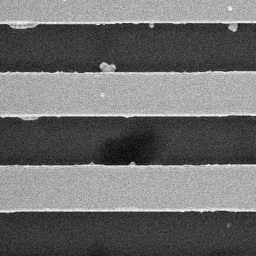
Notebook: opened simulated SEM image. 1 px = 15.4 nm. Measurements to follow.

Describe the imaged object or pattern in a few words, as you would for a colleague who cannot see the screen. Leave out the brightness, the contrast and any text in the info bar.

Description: lines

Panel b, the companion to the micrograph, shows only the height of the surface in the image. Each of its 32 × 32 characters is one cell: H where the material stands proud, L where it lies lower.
HHHHHHHHHHHHHHHHHHHHHHHHHHHHHHHH
HHHHHHHHHHHHHHHHHHHHHHHHHHHHHHHH
HHHHHHHHHHHHHHHHHHHHHHHHHHHHHHHH
LLLLLLLLLLLLLLLLLLLLLLLLLLLLLLLL
LLLLLLLLLLLLLLLLLLLLLLLLLLLLLLLL
LLLLLLLLLLLLLLLLLLLLLLLLLLLLLLLL
LLLLLLLLLLLLLLLLLLLLLLLLLLLLLLLL
LLLLLLLLLLLLLLLLLLLLLLLLLLLLLLLL
LLLLLLLLLLLLLLLLLLLLLLLLLLLLLLLL
HHHHHHHHHHHHHHHHHHHHHHHHHHHHHHHH
HHHHHHHHHHHHHHHHHHHHHHHHHHHHHHHH
HHHHHHHHHHHHHHHHHHHHHHHHHHHHHHHH
HHHHHHHHHHHHHHHHHHHHHHHHHHHHHHHH
HHHHHHHHHHHHHHHHHHHHHHHHHHHHHHHH
LHHLLLLLLLLLLLLLLLLLLLLLLLLLLLLL
LLLLLLLLLLLLLLLLLLLLLLLLLLLLLLLL
LLLLLLLLLLLLLLLLLLLLLLLLLLLLLLLL
LLLLLLLLLLLLLLLLLLLLLLLLLLLLLLLL
LLLLLLLLLLLLLLLLLLLLLLLLLLLLLLLL
LLLLLLLLLLLLLLLLLLLLLLLLLLLLLLLL
LLLLLLLLLLLLLLLLLLLLLLLLLLLLLLLL
HHHHHHHHHHHHHHHHHHHHHHHHHHHHHHHH
HHHHHHHHHHHHHHHHHHHHHHHHHHHHHHHH
HHHHHHHHHHHHHHHHHHHHHHHHHHHHHHHH
HHHHHHHHHHHHHHHHHHHHHHHHHHHHHHHH
HHHHHHHHHHHHHHHHHHHHHHHHHHHHHHHH
LLLLLLLLLLLLLLLLLLLLLLLLLLLLLLLL
LLLLLLLLLLLLLLLLLLLLLLLLLLLLLLLL
LLLLLLLLLLLLLLLLLLLLLLLLLLLLLLLL
LLLLLLLLLLLLLLLLLLLLLLLLLLLLLLLL
LLLLLLLLLLLLLLLLLLLLLLLLLLLLLLLL
LLLLLLLLLLLLLLLLLLLLLLLLLLLLLLLL